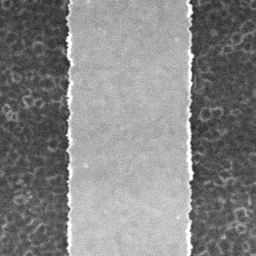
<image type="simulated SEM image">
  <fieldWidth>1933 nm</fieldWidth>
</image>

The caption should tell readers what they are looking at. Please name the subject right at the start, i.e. one or a few lines or trenches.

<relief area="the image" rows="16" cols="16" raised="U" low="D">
DDDDUUUUUUUUDDDD
DDDDUUUUUUUUDDDD
DDDDUUUUUUUUDDDD
DDDDUUUUUUUUDDDD
DDDDUUUUUUUUDDDD
DDDDUUUUUUUUDDDD
DDDDUUUUUUUUDDDD
DDDDUUUUUUUUDDDD
DDDDUUUUUUUUDDDD
DDDDUUUUUUUUDDDD
DDDDUUUUUUUUDDDD
DDDDUUUUUUUUDDDD
DDDDUUUUUUUUDDDD
DDDDUUUUUUUUDDDD
DDDDUUUUUUUUDDDD
DDDDUUUUUUUUDDDD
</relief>